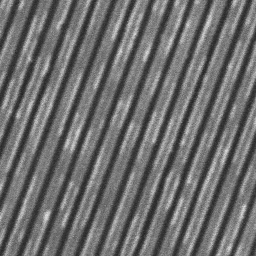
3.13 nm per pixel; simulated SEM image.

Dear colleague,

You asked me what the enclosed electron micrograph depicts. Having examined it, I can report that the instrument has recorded parallel lines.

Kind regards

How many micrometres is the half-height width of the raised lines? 0.0356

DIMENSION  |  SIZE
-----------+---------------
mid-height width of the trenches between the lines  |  23.5 nanometers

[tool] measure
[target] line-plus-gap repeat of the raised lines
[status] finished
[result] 56.7 nanometres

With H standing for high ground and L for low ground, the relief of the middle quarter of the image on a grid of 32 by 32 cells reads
LLLHHLLHHHLLHHHLLHHHLLHHHLLHHHLL
LLHHHLLHHHLLHHHLLHHHLLHHLLHHHLLH
LLHHHLLHHLLHHHLLHHHLLHHHLLHHHLLH
LLHHLLHHHLLHHHLLHHHLLHHHLLHHLLHH
LHHHLLHHHLLHHHLLHHLLHHHLLHHHLLHH
LHHLLHHHLLHHHLLHHHLLHHHLLHHHLLHH
LHHLLHHHLLHHHLLHHHLLHHLLLHHLLHHH
HHHLLHHLLLHHHLLHHLLHHHLLHHHLLHHH
HHLLHHHLLHHHLLHHHLLHHHLLHHHLLHHL
HHLLHHHLLHHHLLHHHLLHHLLHHHLLHHHL
HHLLHHLLHHHLLHHHLLHHHLLHHHLLHHHL
HLLHHHLLHHHLLHHHLLHHHLLHHLLHHHLL
HLLHHHLLHHHLLHHLLLHHLLHHHLLHHHLL
LLHHHLLHHHLLHHHLLHHHLLHHHLLHHLLL
LLHHHLLHHHLLHHHLLHHHLLHHHLHHHLLH
LLHHLLLHHHLLHHLLHHHLLHHHLLHHHLLH
LLHHLLHHHLLHHHLLHHHLLHHHLLHHLLHH
LHHHLLHHHLLHHHLLHHLLHHHLLLHHLLHH
LHHLLLHHLLHHHLLHHHLLHHHLLHHHLLHH
LHHLLHHHLLHHHLLHHHLLHHHLLHHLLHHH
HHHLLHHHLLHHHLLHHLLHHHLLHHHLLHHH
HHLLLHHLLHHHLLHHHLLHHHLLHHHLLHHL
HHLLHHHLLHHHLLHHHLLHHLLLHHLLHHHL
HHLLHHHLLHHLLHHHLLHHHLLHHHLLHHHL
HLLHHHLLHHHLLHHHLLHHHLLHHLLHHHLL
HLLHHHLLHHHLLHHLLLHHLLLHHLLHHHLL
HLLHHLLLHHLLHHHLLHHHLLHHHLLHHLLL
LLHHHLLHHHLLHHHLLHHHLLHHLLHHHLLH
LLHHHLLHHHLLHHLLHHHLLHHHLLHHHLLH
LLHHLLHHHLLHHHLLHHHLLHHHLHHHHLHH
LHHHLLHHHLLHHHLLHHLLHHHLLHHHLLHH
LHHLLLHHLLHHHLLHHHLLHHHLLHHHLLHH